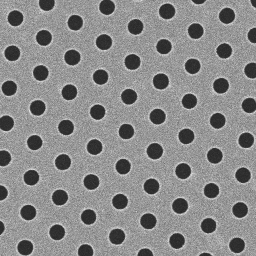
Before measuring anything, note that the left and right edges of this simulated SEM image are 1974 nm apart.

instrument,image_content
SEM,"a regular array of holes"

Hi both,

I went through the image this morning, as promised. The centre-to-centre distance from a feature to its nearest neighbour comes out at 266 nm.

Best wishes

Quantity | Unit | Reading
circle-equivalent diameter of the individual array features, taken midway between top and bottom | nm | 122